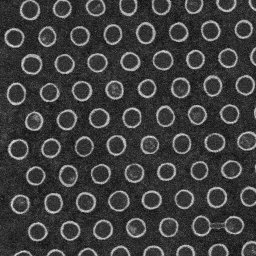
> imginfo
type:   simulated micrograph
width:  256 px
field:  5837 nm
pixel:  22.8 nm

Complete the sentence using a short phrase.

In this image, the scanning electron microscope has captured a regular array of raised bodies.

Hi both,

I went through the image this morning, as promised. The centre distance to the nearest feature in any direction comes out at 0.724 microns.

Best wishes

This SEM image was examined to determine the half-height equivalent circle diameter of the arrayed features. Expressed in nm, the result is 414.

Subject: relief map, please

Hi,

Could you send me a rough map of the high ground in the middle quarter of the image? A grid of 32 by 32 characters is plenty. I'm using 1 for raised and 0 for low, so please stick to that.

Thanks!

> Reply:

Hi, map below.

11000011110000011100000111100000
11000001110000000000000000000000
00000000000000000000000000000000
00000000000000000000000000000000
00000000000011000001110000011110
00011100000111000001111000011110
00111110000111100001111000011110
00111100000111000001110000011110
00011100000000000000000000000000
00000000000000000000000000000000
00000000000000000000000000000000
00000000110000001100000011100000
11100001111000011110000011100001
11100001111000011110000011100000
11100001111000011110000011100000
11000000110000001100000000000000
00000000000000000000000000000000
00000000000000000000000000000000
00000100000011000000111000001110
00011110000111100001111100011110
00011110000111100001111100011111
00011110000111100000111000001110
00001100000000000000000000000000
00000000000000000000000000000000
00000000000000000000000000000000
00000000110000001110000011100000
11100001111000001111000011110000
11100001111000011111000011110000
11100001111000001110000011100000
11100000110000000000000000000000
00000000000000000000000000000000
00000000000000000000000000000000